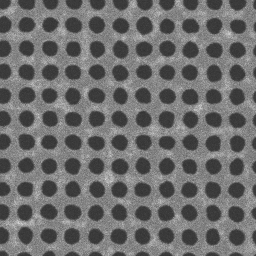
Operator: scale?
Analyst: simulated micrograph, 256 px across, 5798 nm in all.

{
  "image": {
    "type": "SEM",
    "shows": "a regular array of holes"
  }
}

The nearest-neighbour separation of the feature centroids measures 0.518 microns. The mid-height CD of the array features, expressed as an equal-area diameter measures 16.5 px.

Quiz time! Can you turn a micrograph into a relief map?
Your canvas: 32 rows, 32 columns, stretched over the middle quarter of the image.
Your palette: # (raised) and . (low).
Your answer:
#..####...###..####..####..###..
....##....##....##....##....#...
....##....##....##....##....#...
#...###...###...###..###...###..
################################
################################
#..####..####..###...####..###..
....##....##....##....##....#...
....##....##....##....##....#...
#...###...###...###...##...###..
################################
################################
#...##....##...###...###...###..
....##....##....##....##....##..
....##....##....##....##...###..
#...###..####..####..###...####.
################################
################################
....##....##....##....##...###..
.....#....##....##....##....#...
#...##....##....##....##....##..
##..###..####..####..##########.
################################
#..################.#####.######
....##....##....##...###...###..
....##....##....##....##....##..
....##....##....##....##...###..
#..#####.####..####..###...####.
################################
#..####..####..####.#####..#####
....##....##....##....##...###..
....##....##....##....##....#...